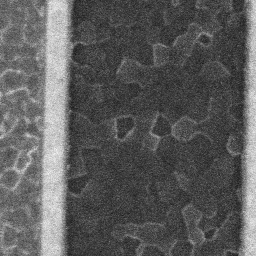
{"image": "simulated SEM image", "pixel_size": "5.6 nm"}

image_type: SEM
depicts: one or a few lines or trenches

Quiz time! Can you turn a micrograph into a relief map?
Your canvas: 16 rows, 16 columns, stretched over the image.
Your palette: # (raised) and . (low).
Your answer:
####............
###.............
###.............
###.............
###.............
###.............
###.............
###.............
###.............
###.............
###.............
###.............
###.............
###.............
###.............
###.............